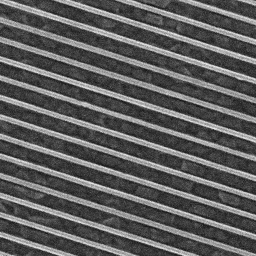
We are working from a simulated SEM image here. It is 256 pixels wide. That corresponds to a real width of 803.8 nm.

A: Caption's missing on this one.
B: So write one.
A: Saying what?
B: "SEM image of parallel lines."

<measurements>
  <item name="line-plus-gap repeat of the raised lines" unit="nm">58.4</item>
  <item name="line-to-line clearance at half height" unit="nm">44.2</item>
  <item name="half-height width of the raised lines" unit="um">0.0146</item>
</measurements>